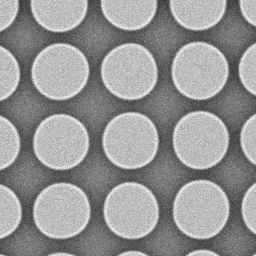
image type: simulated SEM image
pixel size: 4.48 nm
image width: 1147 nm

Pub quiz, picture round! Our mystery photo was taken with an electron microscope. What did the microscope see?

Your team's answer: an array of small figures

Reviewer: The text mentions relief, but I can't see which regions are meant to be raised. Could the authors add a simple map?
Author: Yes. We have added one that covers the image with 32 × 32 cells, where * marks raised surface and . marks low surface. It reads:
**..*******..******..*******..**
**..*******..******...******..**
**...*****....*****...*****....*
*.....***......***......**......
................................
........................**......
*....*****....*****...*****....*
**..*******..******...******..**
**..*******..******...******..**
**..*******..*******..******..**
**..*******..******...******..**
**...*****....*****....****....*
................................
................................
.......*.......***.....****.....
*....*****....*****...******...*
**...******..*******..******..**
**..*******..*******..******..**
**..*******..*******..******..**
**...******..******...******...*
*.....****....****.....****.....
................................
................................
*.....****....****.....****....*
**...******...*****...******...*
**..*******..*******..*******.**
***.*******..*******..*******.**
**..*******..*******..******...*
**...*****....*****...******...*
*.....***......***......***.....
................................
................*.......**......